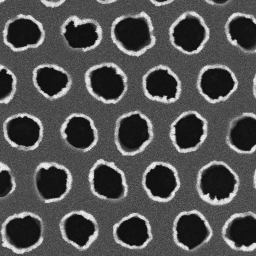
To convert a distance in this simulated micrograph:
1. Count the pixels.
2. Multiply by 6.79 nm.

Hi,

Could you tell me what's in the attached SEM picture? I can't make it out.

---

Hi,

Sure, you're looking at a regular array of holes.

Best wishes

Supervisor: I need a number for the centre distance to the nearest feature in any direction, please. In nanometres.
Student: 370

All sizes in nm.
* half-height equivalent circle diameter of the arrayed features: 211